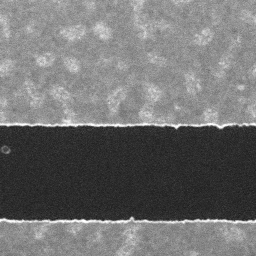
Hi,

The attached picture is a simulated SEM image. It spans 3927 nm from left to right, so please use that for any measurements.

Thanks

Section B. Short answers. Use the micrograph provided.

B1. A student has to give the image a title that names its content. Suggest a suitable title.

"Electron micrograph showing one or a few lines or trenches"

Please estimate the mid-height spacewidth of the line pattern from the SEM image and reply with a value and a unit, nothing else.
95.8 px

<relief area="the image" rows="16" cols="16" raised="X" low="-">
XXXXXXXXXXXXXXXX
XXXXXXXXXXXXXXXX
XXXXXXXXXXXXXXXX
XXXXXXXXXXXXXXXX
XXXXXXXXXXXXXXXX
XXXXXXXXXXXXXXXX
XXXXXXXXXXXXXXXX
XXXXXXXXXXXXXXXX
----------------
----------------
----------------
----------------
----------------
----------------
XXXXXXXXXXXXXXXX
XXXXXXXXXXXXXXXX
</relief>